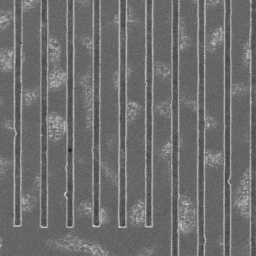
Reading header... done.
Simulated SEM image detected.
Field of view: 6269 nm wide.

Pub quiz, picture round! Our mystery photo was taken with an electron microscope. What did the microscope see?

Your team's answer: parallel lines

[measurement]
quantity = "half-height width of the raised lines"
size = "502 nm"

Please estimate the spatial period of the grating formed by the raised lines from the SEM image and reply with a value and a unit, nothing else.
0.641 microns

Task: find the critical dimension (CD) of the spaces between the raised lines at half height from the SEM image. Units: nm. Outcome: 153